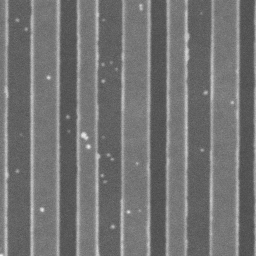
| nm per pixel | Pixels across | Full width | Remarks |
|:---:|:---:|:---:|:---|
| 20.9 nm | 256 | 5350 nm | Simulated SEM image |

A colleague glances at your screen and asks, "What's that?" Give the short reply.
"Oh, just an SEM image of lines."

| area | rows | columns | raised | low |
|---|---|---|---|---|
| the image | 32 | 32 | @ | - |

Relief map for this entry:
@---@@@---@@---@@@@--@@----@@@--
@---@@@---@@---@@@@--@@----@@@--
@---@@@---@@---@@@@--@@----@@@--
@---@@@---@@---@@@@--@@----@@@--
@---@@@---@@---@@@@--@@@---@@@--
@---@@@---@@---@@@@--@@----@@@--
@---@@@---@@---@@@@--@@@---@@@--
@---@@@---@@---@@@@--@@---@@@@--
@---@@@---@@---@@@@--@@----@@@--
@---@@@---@@---@@@@--@@----@@@--
@---@@@---@@---@@@@--@@---@@@@--
@---@@@---@@---@@@@--@@---@@@@--
@---@@@---@@---@@@@--@@---@@@@--
@---@@@---@@---@@@@--@@---@@@@--
@---@@@---@@---@@@@--@@---@@@@--
@---@@@---@@---@@@@--@@---@@@@--
@---@@@---@@---@@@@--@@---@@@@--
@---@@@---@@---@@@@--@@---@@@@--
@---@@@---@@---@@@@--@@---@@@@--
@---@@@---@@---@@@@--@@---@@@@--
@---@@@---@@---@@@@--@@---@@@@--
@---@@@---@@---@@@@--@@---@@@@--
@---@@@---@@---@@@@--@@---@@@@--
@---@@@---@@---@@@@--@@---@@@@--
@---@@@---@@---@@@@--@@---@@@@--
@---@@@---@@---@@@@--@@---@@@@--
@---@@@---@@---@@@@--@@---@@@@--
@---@@@---@@---@@@@--@@---@@@@--
@---@@@---@@---@@@@--@@---@@@@--
@---@@@---@@---@@@@--@@---@@@@--
@---@@@---@@---@@@@--@@---@@@@--
@---@@@---@@---@@@@--@@---@@@@--